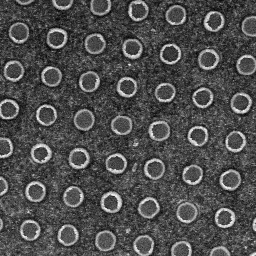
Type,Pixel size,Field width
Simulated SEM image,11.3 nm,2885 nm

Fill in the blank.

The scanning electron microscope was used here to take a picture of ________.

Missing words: a regular array of raised bodies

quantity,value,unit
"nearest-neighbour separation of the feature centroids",429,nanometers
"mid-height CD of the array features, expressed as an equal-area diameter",222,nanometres